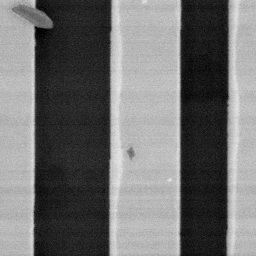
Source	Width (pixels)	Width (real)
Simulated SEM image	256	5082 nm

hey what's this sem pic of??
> lines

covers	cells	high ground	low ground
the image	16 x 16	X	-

XX-----XXXX----X
XXX----XXXX---XX
XX-----XXXX---XX
XX-----XXXX---XX
XX-----XXXX---XX
XX-----XXXX---XX
XX-----XXXX---XX
XX-----XXXX---XX
XX-----XXXX---XX
XX-----XXXX---XX
XX-----XXXX---XX
XX-----XXXX---XX
XX-----XXXX---XX
XX-----XXXX---XX
XX-----XXXX---XX
XX-----XXXX---XX